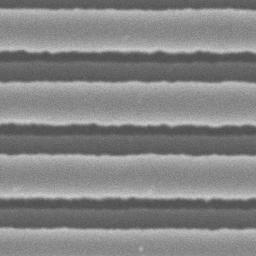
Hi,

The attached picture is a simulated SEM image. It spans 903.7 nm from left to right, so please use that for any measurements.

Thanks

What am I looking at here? lines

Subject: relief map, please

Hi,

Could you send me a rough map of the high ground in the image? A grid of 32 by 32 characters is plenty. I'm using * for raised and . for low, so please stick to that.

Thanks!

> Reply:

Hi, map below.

................................
********************************
********************************
********************************
********************************
********************************
......*...........*..*.*...*...*
................................
................................
................................
********************************
********************************
********************************
********************************
********************************
......***...********.***********
................................
................................
................................
**************.*********.******.
********************************
********************************
********************************
********************************
********************************
................................
................................
................................
**.....*........................
********************************
********************************
********************************